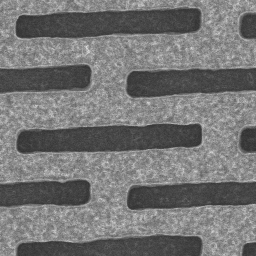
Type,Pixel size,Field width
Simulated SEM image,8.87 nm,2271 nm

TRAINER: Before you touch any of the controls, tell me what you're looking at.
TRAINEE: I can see holes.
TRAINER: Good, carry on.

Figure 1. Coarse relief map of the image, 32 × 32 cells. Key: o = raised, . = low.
oooooooooooooooooooooooooooooooo
ooooooooo................ooooooo
oo.......................ooooo..
oo.......................ooooo..
oo..........oooooooooooooooooo..
oooooooooooooooooooooooooooooooo
oooooooooooooooooooooooooooooooo
oooooooooooooooooooooooooooooooo
oooo.......ooooooooooooo.oooo.oo
...........ooooo................
...........ooooo................
.ooo.ooooooooooo.............ooo
oooooooooooooooooooooooooooooooo
oooooooooooooooooooooooooooooooo
oooooooooooooooooooooooooooooooo
oooooooooooooooooooo.ooo.ooooooo
ooo......................ooooo..
oo.......................ooooo..
oo...................ooooooooo..
oooooooooooooooooooooooooooooooo
oooooooooooooooooooooooooooooooo
oooooooooooooooooooooooooooooooo
ooooooooo.oooooooooooooooooooooo
...........ooooo................
...........ooooo................
...........ooooo...............o
oooooooooooooooooooooooooooooooo
oooooooooooooooooooooooooooooooo
oooooooooooooooooooooooooooooooo
ooooooooooooooooo.......oooooooo
ooo......................oooooo.
oo.......................ooooo..